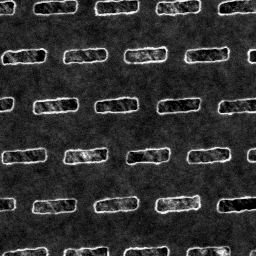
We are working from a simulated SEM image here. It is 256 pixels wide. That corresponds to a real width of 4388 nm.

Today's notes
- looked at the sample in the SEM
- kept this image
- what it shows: a regular array of holes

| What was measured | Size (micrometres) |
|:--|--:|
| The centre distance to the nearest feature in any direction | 0.99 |